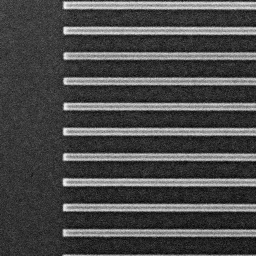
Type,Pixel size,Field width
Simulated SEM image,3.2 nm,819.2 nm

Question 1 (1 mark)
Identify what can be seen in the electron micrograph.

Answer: parallel lines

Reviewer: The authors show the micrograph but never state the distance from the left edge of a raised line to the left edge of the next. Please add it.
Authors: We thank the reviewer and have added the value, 80.8 nm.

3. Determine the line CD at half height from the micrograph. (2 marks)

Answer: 20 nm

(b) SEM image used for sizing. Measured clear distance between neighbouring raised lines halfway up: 59.6 nm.